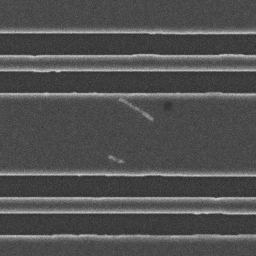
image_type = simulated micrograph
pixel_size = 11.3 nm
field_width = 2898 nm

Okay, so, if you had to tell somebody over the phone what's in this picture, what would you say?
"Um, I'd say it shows lines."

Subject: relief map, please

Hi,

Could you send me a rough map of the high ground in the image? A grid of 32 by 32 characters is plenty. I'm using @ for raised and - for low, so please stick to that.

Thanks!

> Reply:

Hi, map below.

@@@@@@@@@@@@@@@@@@@@@@@@@@@@@@@@
@@@@@@@@@@@@@@@@@@@@@@@@@@@@@@@@
@@@@@@@@@@@@@@@@@@@@@@@@@@@@@@@@
@@@@@@@@@@@@@@@@@@@@@@@@@@@@@@@@
--------------------------------
--------------------------------
--------------------------------
@@@@@@@@@@@@@@@@@@@@@@@@@@@@@@@@
@@@@@@@@@@@@@@@@@@@@@@@@@@@@@@@@
--------------------------------
--------------------------------
--------------------------------
@@@@@@@@@@@@@@@@@@@@@@@@@@@@@@@@
@@@@@@@@@@@@@@@@@@@@@@@@@@@@@@@@
@@@@@@@@@@@@@@@@@@@@@@@@@@@@@@@@
@@@@@@@@@@@@@@@@@@@@@@@@@@@@@@@@
@@@@@@@@@@@@@@@@@@@@@@@@@@@@@@@@
@@@@@@@@@@@@@@@@@@@@@@@@@@@@@@@@
@@@@@@@@@@@@@@@@@@@@@@@@@@@@@@@@
@@@@@@@@@@@@@@@@@@@@@@@@@@@@@@@@
@@@@@@@@@@@@@@@@@@@@@@@@@@@@@@@@
@@@@@@@@@@@@@@@@@@@@@@@@@@@@@@@@
--------------------------------
--------------------------------
--------------------------------
@@@@@@@@@@@@@@@@@@@@@@@@@@@@@@@@
@@@@@@@@@@@@@@@@@@@@@@@@@@@@@@@@
--------------------------------
--------------------------------
-------@@-@@--------------------
@@@@@@@@@@@@@@@@@@@@@@@@@@@@@@@@
@@@@@@@@@@@@@@@@@@@@@@@@@@@@@@@@